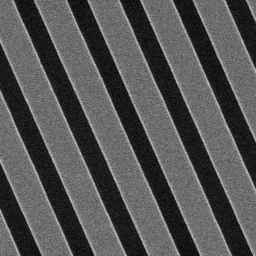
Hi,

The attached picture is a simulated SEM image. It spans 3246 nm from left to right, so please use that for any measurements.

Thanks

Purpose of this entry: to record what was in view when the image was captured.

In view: lines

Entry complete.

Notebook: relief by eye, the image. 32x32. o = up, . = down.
oo..ooooo..oooo...oooo..oooo...o
oo...oooo...oooo..oooo...oooo..o
ooo..oooo...oooo...oooo..oooo...
ooo...oooo..oooo...oooo...oooo..
oooo..oooo...oooo..ooooo..oooo..
oooo...oooo..oooo...oooo...oooo.
.oooo..oooo...oooo..oooo...oooo.
.oooo...oooo..oooo...oooo..oooo.
.oooo...oooo...oooo..oooo...oooo
..oooo..ooooo..oooo...oooo..oooo
..oooo...oooo...oooo..oooo...ooo
...oooo..oooo...oooo...oooo..ooo
o..oooo...oooo..oooo...oooo...oo
o...oooo..oooo...oooo..oooo...oo
o...oooo...oooo..oooo...oooo...o
oo...ooo...oooo...oooo..oooo...o
oo...oooo...oooo..oooo...oooo..o
ooo..oooo...oooo...oooo..oooo...
ooo...oooo...oooo..oooo...oooo..
oooo..oooo...oooo..oooo...oooo..
oooo...oooo..oooo...oooo...oooo.
.oooo..oooo...oooo..oooo...oooo.
.oooo...oooo..oooo...oooo..oooo.
.oooo...oooo...oooo..oooo...oooo
..oooo...ooo...oooo...oooo..oooo
..oooo...oooo...oooo..oooo...ooo
...oooo..oooo...oooo...oooo..ooo
o..oooo...oooo...oooo..oooo...oo
o...oooo..oooo...oooo..oooo...oo
o...oooo...oooo..oooo...oooo...o
oo...ooo...oooo...oooo..oooo...o
oo...oooo...oooo..oooo...oooo..o